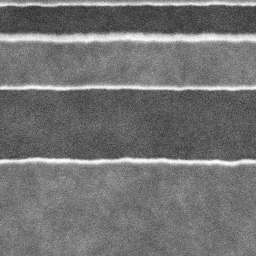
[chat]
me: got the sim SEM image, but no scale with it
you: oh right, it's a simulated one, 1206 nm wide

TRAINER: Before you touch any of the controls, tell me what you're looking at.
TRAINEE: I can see lines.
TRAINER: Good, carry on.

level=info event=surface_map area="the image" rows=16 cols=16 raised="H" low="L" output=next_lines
LLLLLLLLLLLLLLLL
LLLLLLLLLLLLLLLL
HHHHHHHHHHHHHHHH
HHHHHHHHHHHHHHHH
HHHHHHHHHHHHHHHH
LLLHHLLLLLHHLHHL
LLLLLLLLLLLLLLLL
LLLLLLLLLLLLLLLL
LLLLLLLLLLLLLLLL
LLLLLLLLLLLLLLLL
HHHHHHHHHHHHHHHH
HHHHHHHHHHHHHHHH
HHHHHHHHHHHHHHHH
HHHHHHHHHHHHHHHH
HHHHHHHHHHHHHHHH
HHHHHHHHHHHHHHHH